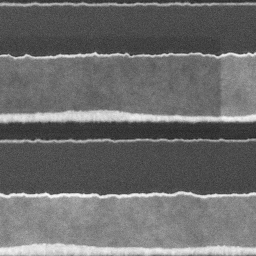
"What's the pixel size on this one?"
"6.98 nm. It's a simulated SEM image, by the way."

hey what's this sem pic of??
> lines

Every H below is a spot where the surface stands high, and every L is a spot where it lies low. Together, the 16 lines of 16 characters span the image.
LLLLLLLLLLLLLLLL
LLLLLLLLLLLLLLLL
LLLLLLLLLLLLLLLL
HLLHHHHHHHHHHHHH
HHHHHHHHHHHHHHHH
HHHHHHHHHHHHHHHH
HHHHHHHHHHHHHHHH
LLLLLLLLLLLLHLLL
LLLLLLLLLLLLLLLL
LLLLLLLLLLLLLLLL
LLLLLLLLLLLLLLLL
LLLLLLLLLLLLLLLL
HHHHHHHHHHHHHHHH
HHHHHHHHHHHHHHHH
HHHHHHHHHHHHHHHH
HHHHHHHHHHHHHHHH